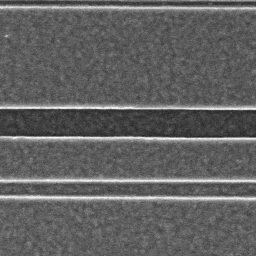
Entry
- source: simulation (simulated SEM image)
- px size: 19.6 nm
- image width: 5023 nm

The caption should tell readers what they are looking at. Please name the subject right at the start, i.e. lines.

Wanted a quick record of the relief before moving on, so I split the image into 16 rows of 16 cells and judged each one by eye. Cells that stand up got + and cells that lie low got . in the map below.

++++++++++++++++
++++++++++++++++
++++++++++++++++
++++++++++++++++
++++++++++++++++
++++++++++++++++
++++++++++++++++
................
................
++++++++++++++++
++++++++++++++++
++++++++++++++++
++++++++++++++++
++++++++++++++++
++++++++++++++++
++++++++++++++++